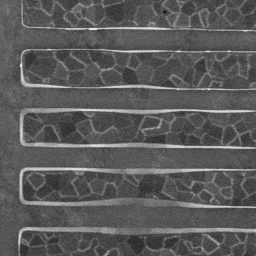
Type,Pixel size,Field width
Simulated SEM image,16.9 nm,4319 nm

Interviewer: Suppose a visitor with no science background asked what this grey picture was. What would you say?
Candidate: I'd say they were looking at groups of lines, slits or small figures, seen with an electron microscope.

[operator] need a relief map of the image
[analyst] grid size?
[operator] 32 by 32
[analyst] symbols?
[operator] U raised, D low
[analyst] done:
DDDUUUUUUUUUUUUUUUUUUUUUUUUUUUUU
DDDUUUUUUUUUUUUUUUUUUUUUUUUUUUUU
DDDUUUUUUUUUUUUUUUUUUUUUUUUUUUUU
DDDDDDDUUUUUUUDDDUUUUUUUUUUUUUUU
DDDDDDDDDDDDDDDDDDDDDDDDDDDDDDDD
DDDDDDDDDDDDDDDDDDDDDDDDDDDDDDDD
DDDUUUUUUUUUUUUUUUUUUUUUUUUUUUUU
DDDUUUUUUUUUUUUUUUUUUUUUUUUUUUUU
DDDUUUUUUUUUUUUUUUUUUUUUUUUUUUUU
DDDUUUUUUUUUUUUUUUUUUUUUUUUUUUUU
DDDUUUUUUUUUUUUUUUUUUUUUUUUUUUUU
DDDDDDDDDDDDDDDDDDDDDDDDDDDDDDDD
DDDDDDDDDDDDDDDDDDDDDDDDDDDDDDDD
DDDDDDDDDDDDDDDDDDDDDDDDDDDDDDDD
DDDUUUUUUUUUUUUUUUUUUUUUUUUUUUUU
DDDUUUUUUUUUUUUUUUUUUUUUUUUUUUUU
DDDUUUUUUUUUUUUUUUUUUUUUUUUUUUUU
DDDUUUUUUUUUUUUUUUUUUUUUUUUUUUUU
DDDDDDDDDDDDDDDDDDDDDDDDDDDDDDDD
DDDDDDDDDDDDDDDDDDDDDDDDDDDDDDDD
DDDDDDDDDDDDDDDDDDDDDDDDDDDDDDDD
DDDUUUUUUUUUUUUUUUUUUUUUUUUUUUUU
DDDUUUUUUUUUUUUUUUUUUUUUUUUUUUUU
DDDUUUUUUUUUUUUUUUUUUUUUUUUUUUUU
DDDUUUUUUUUUUUUUUUUUUUUUUUUUUUUU
DDDDDDDDUUDDDDDDDDDDDDUUUUUUUUUU
DDDDDDDDDDDDDDDDDDDDDDDDDDDDDDDD
DDDDDDDDDDDDDDDDDDDDDDDDDDDDDDDD
DDDDDDDDDDDDDDDDDDDDDDDDDDDDDDDD
DDUUUUUUUUUUUUUUUUUUUUUUUUUUUUUU
DDUUUUUUUUUUUUUUUUUUUUUUUUUUUUUU
DDUUUUUUUUUUUUUUUUUUUUUUUUUUUUUU